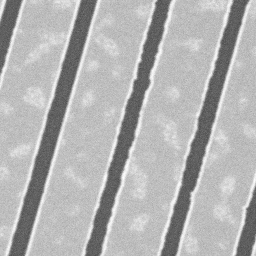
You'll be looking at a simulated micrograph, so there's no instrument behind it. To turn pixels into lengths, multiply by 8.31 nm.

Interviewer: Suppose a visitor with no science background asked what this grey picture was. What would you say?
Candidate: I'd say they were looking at one or a few lines or trenches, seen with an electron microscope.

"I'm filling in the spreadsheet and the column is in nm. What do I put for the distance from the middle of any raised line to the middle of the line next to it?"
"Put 602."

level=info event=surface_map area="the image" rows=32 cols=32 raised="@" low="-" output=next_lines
---@@@@@@@--@@@@@@@---@@@@@@@--@
---@@@@@@---@@@@@@@--@@@@@@@---@
--@@@@@@@---@@@@@@@--@@@@@@@--@@
--@@@@@@@--@@@@@@@---@@@@@@@--@@
--@@@@@@@--@@@@@@@--@@@@@@@@--@@
-@@@@@@@---@@@@@@@--@@@@@@@---@@
-@@@@@@@---@@@@@@@--@@@@@@@--@@@
-@@@@@@@--@@@@@@@---@@@@@@@--@@@
-@@@@@@---@@@@@@@--@@@@@@@@--@@@
@@@@@@@---@@@@@@@--@@@@@@@--@@@@
@@@@@@@--@@@@@@@@--@@@@@@@--@@@@
@@@@@@@--@@@@@@@--@@@@@@@@--@@@@
@@@@@@---@@@@@@@--@@@@@@@---@@@@
@@@@@@---@@@@@@---@@@@@@@--@@@@@
@@@@@@--@@@@@@@---@@@@@@@--@@@@@
@@@@@@--@@@@@@@--@@@@@@@@--@@@@@
@@@@@---@@@@@@@--@@@@@@@---@@@@@
@@@@@--@@@@@@@@--@@@@@@@--@@@@@@
@@@@@--@@@@@@@---@@@@@@@--@@@@@@
@@@@---@@@@@@@--@@@@@@@---@@@@@@
@@@@---@@@@@@@--@@@@@@@--@@@@@@@
@@@@--@@@@@@@---@@@@@@@--@@@@@@@
@@@@--@@@@@@@--@@@@@@@@--@@@@@@@
@@@---@@@@@@@--@@@@@@@---@@@@@@@
@@@--@@@@@@@---@@@@@@@--@@@@@@@-
@@@--@@@@@@@--@@@@@@@@--@@@@@@@-
@@---@@@@@@@--@@@@@@@---@@@@@@@-
@@---@@@@@@@--@@@@@@@--@@@@@@@--
@@--@@@@@@@---@@@@@@@--@@@@@@@--
@---@@@@@@@--@@@@@@@---@@@@@@@--
@---@@@@@@@--@@@@@@@---@@@@@@@--
@--@@@@@@@---@@@@@@@--@@@@@@@---